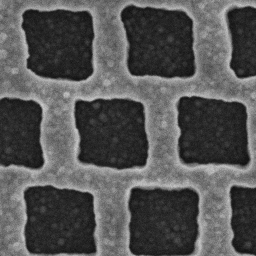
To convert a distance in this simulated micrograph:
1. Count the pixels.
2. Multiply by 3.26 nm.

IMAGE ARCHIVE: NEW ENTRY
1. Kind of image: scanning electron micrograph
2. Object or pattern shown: holes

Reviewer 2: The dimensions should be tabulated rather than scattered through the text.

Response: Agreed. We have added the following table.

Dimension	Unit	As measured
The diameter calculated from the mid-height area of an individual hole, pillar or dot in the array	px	76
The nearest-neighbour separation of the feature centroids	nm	326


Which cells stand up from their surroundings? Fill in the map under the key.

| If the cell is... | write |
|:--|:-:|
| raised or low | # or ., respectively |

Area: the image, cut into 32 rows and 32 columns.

################################
###........####........#####....
###.........###.........####....
###.........####........#####...
###.........####........#####...
###.........####........#####...
####........####........#####...
###.........####........#####...
####........####.........####...
#####......######.#.....######..
################################
################################
...#########.#...#####.....#####
.....####.........####.........#
.....####.........####.........#
.....####.........####.........#
.....#####........#####........#
.....#####........####.........#
.....#####.........###.........#
......####........####.........#
......#####.......#####........#
################################
################################
###....##########...###.#####...
###.........####.........####...
###.........####.........####...
###.........####.........####...
###.........####.........####...
###.........####.........####...
###.........####.........####...
###.........####........#####...
####........####........######..